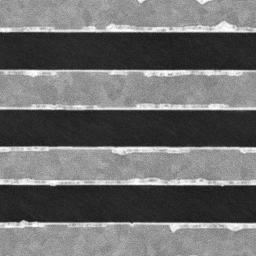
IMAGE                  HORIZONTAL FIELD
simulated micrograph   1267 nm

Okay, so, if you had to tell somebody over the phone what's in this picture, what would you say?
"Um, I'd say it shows one or a few lines or trenches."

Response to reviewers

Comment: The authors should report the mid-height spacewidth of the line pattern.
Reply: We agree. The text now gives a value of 0.194 micrometres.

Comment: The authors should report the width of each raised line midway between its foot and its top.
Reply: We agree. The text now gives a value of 185 nm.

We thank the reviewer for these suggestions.